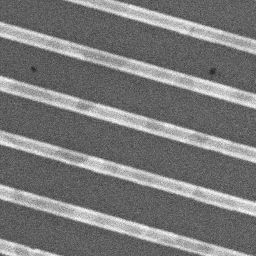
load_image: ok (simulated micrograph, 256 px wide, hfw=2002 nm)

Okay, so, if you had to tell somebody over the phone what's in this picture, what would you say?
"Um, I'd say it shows parallel lines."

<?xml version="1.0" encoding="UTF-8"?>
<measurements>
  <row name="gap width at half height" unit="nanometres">325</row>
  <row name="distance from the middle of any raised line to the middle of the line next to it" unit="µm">0.408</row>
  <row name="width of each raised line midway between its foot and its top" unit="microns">0.0828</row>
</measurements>